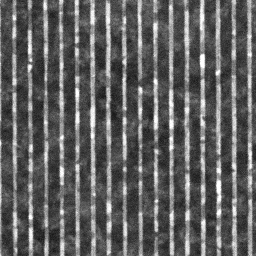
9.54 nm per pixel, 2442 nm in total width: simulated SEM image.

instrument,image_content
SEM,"parallel lines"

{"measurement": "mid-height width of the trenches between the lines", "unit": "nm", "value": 123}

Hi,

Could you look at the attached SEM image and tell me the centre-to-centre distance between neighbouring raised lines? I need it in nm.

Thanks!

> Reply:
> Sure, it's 149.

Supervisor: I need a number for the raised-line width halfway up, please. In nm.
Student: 26.2